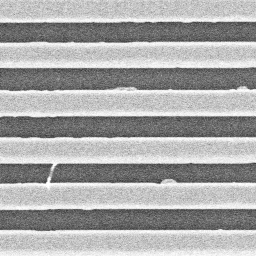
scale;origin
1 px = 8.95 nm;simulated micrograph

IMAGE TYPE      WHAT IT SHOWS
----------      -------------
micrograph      lines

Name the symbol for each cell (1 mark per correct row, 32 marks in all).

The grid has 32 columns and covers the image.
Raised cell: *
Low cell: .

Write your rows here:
********************************
********************************
********************************
................................
................................
********************************
********************************
********************************
................................
................................
................................
********************************
********************************
********************************
......*.........................
................................
................................
********************************
********************************
********************************
................................
................................
................................
********************************
********************************
********************************
................................
................................
................................
********************************
********************************
********************************